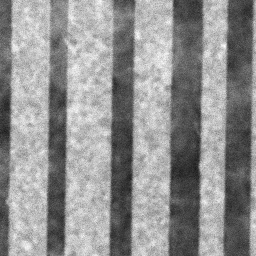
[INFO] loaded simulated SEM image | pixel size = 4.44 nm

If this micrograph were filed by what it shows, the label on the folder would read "one or a few lines or trenches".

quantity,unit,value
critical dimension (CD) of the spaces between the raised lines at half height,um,0.114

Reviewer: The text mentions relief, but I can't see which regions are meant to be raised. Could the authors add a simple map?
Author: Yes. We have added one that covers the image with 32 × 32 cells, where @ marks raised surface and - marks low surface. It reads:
--@@@@---@@@@@---@@@@----@@@----
--@@@@---@@@@@---@@@@----@@@----
--@@@@---@@@@@---@@@@----@@@----
--@@@@---@@@@@---@@@@-----@@----
--@@@@---@@@@@---@@@@-----@@----
--@@@@---@@@@@---@@@@-----@@----
--@@@@---@@@@@---@@@@-----@@----
--@@@@---@@@@@---@@@@----@@@----
--@@@@---@@@@@---@@@@----@@@----
--@@@@---@@@@@---@@@@----@@@----
--@@@@---@@@@@---@@@@-----@@----
-@@@@@---@@@@@---@@@@----@@@----
-@@@@@---@@@@@---@@@@----@@@----
-@@@@@---@@@@@---@@@@----@@@----
-@@@@@--@@@@@@---@@@@----@@@----
--@@@@--@@@@@@---@@@@----@@@----
-@@@@@--@@@@@@---@@@@----@@@----
-@@@@@--@@@@@@---@@@@----@@@---@
-@@@@@--@@@@@@---@@@@----@@@---@
-@@@@@--@@@@@@---@@@@----@@@----
-@@@@@--@@@@@@---@@@@----@@@----
-@@@@@---@@@@@---@@@@----@@@----
-@@@@@--@@@@@@---@@@@----@@@----
-@@@@@--@@@@@@---@@@@----@@@----
-@@@@@--@@@@@@---@@@@----@@@----
-@@@@@--@@@@@@---@@@@----@@@---@
-@@@@@--@@@@@@---@@@@----@@@---@
-@@@@@--@@@@@@---@@@@----@@@---@
-@@@@@--@@@@@@---@@@@----@@@---@
-@@@@@--@@@@@@---@@@@----@@@---@
-@@@@@--@@@@@@---@@@@----@@@---@
-@@@@@--@@@@@----@@@@----@@@---@